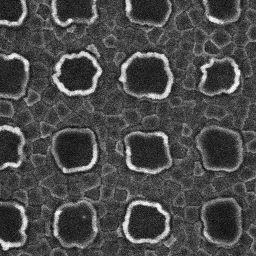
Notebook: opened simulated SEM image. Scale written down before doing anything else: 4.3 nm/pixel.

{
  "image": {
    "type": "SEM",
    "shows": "a regular array of raised bodies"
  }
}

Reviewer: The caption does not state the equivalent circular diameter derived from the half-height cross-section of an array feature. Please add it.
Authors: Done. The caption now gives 194 nm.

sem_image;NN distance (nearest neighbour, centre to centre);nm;304